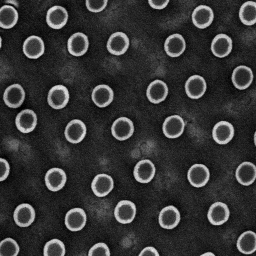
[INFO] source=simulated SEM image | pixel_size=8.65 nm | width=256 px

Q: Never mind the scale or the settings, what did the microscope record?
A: a regular array of raised bodies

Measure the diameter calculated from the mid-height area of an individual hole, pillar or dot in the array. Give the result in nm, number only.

176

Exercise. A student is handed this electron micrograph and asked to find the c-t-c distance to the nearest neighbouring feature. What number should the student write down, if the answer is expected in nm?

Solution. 336